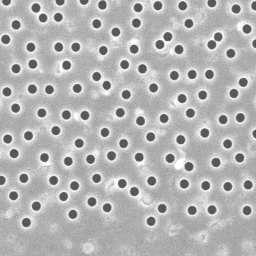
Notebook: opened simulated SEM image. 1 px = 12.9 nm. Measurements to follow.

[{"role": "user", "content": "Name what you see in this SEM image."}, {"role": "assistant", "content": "a regular array of holes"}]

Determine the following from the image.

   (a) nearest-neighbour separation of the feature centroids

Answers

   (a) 0.241 micrometres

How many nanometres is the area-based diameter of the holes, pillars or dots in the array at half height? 118